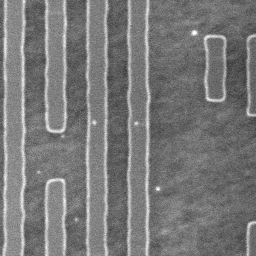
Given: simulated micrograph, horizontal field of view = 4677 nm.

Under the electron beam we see groups of lines, slits or small figures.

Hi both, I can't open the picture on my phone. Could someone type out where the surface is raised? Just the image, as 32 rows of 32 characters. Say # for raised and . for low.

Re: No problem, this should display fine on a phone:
.##...##...##...##..............
.##...##...##...##..............
.##...##...##...##..............
.##...##...##...##..............
.##...##...##...##..............
.##...##...##...##........##...#
.##...##...##...##........##...#
.##...##...##...##........##...#
.##...##...##...##........##...#
.##...##...##...##........##...#
.##...##...##...##........##...#
.##...##...##...###.......##...#
.##...##...##...###.......##...#
.##...##...##...###............#
.##...##...##...##..............
.##...##...##...##..............
.##........##...###.............
.##........##...###.............
.##........##...##..............
.##........##...##..............
.##........##...##..............
.##........##...##..............
.##....#...##...##..............
.##...##...##...##..............
.##...##...##...##..............
.##...##...##...##..............
.##...##...##...##..............
.##...##...##...##..............
.##...##...##...##.............#
.##...##...##...##.............#
.##...##...##...##.............#
.##...##...##...##.............#